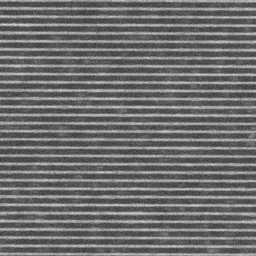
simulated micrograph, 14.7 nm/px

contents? parallel lines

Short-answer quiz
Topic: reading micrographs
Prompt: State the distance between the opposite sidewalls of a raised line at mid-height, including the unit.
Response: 23.9 nm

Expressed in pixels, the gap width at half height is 6.5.